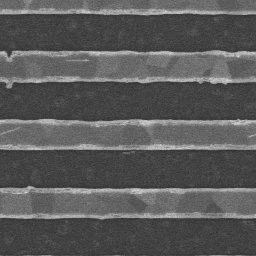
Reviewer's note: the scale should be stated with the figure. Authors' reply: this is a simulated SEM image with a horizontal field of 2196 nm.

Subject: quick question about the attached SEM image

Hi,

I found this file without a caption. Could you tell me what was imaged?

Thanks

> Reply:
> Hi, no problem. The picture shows one or a few lines or trenches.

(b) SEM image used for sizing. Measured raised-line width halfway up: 233 nm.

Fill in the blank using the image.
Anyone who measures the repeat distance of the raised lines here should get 584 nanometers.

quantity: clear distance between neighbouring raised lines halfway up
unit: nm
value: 348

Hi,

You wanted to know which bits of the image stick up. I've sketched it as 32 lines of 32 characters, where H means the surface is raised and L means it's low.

HHHHHHHHHHHHHHHHHHHHHHHHHHHHHHHH
HHHLLLLHHHHHHHHHHHHHHHLLLHHHHHHH
LLLLLLLLLLLLLLLLLLLLLLLLLLLLLLLL
LLLLLLLLLLLLLLLLLLLLLLLLLLLLLLLL
LLLLLLLLLLLLLLLLLLLLLLLLLLLLLLLL
LLLLLLLLLLLLLLLLLLLLLLLLLLLLLLLL
LLLLLLLLLLLLLLLLLLLLLLLLLLLLLLLL
HHHHHHHHHHHHHHHHHHHHHHHHHHHHHHHH
HHHHHHHHHHHHHHHHHHHHHHHHHHHHHHHH
HHHHHHHHHHHHHHHHHHHHHHHHHHHHHHHH
LLLLLLLLLLLLLLLLLLLLLLLLLLLLLLLL
LLLLLLLLLLLLLLLLLLLLLLLLLLLLLLLL
LLLLLLLLLLLLLLLLLLLLLLLLLLLLLLLL
LLLLLLLLLLLLLLLLLLLLLLLLLLLLLLLL
LLLLLLLLLLLLLLLLLLLLLLLLLLLLLLLL
HHHHHHHHHHHHHHHHHHHHHHHHHHHHHHHH
HHHHHHHHHHHHHHHHHHHHHHHHHHHHHHHH
HHHHHHHHHHHHHHHHHHHHHHHHHHHHHHHH
HHHHHHLLLLLLHHHHHHHHHHHHLLHLLHHH
LLLLLLLLLLLLLLLLLLLLLLLLLLLLLLLL
LLLLLLLLLLLLLLLLLLLLLLLLLLLLLLLL
LLLLLLLLLLLLLLLLLLLLLLLLLLLLLLLL
LLLLLLLLLLLLLLLLLLLLLLLLLLLLLLLL
LLLHLLLLLLLLLLLLLLLLLLLLLLLLLLLL
HHHHHHHHHHHHHHHHHHHHHHHHHHHHHHHH
HHHHHHHHHHHHHHHHHHHHHHHHHHHHHHHH
HHHHHHHHHHHHHHHHHHHHHHHHHHHHHHHH
LLLLLLLLLLLLLLLLLLLLLLLLLLLLLLLL
LLLLLLLLLLLLLLLLLLLLLLLLLLLLLLLL
LLLLLLLLLLLLLLLLLLLLLLLLLLLLLLLL
LLLLLLLLLLLLLLLLLLLLLLLLLLLLLLLL
LLLLLLLLLLLLLLLLLLLLLLLLLLLLLLLL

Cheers